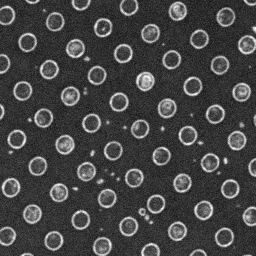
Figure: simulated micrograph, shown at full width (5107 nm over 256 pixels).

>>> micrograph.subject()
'a regular array of raised bodies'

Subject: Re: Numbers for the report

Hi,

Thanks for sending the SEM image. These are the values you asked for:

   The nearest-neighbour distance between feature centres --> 673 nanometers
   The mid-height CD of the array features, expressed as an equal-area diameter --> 348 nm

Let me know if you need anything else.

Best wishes